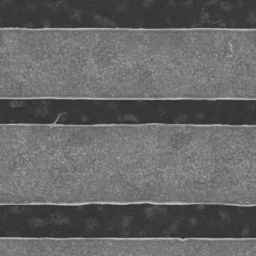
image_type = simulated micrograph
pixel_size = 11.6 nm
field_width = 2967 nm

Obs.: one or a few lines or trenches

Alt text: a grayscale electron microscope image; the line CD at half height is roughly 862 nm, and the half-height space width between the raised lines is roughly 0.351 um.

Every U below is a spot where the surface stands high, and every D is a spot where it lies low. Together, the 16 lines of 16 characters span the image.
DDDDDDDDDDDDDDDD
DDDDDDDDDDDDDDDD
UUUUUUUUUUUUUUUU
UUUUUUUUUUUUUUUU
UUUUUUUUUUUUUUUU
UUUUUUUUUUUUUUUU
DDDDDDDDDDDDDDDD
DDDDDDDDDDDDDDDD
UUUUUUUUUUUUUUUU
UUUUUUUUUUUUUUUU
UUUUUUUUUUUUUUUU
UUUUUUUUUUUUUUUU
UUUUUUUUUUUUUUUU
DDDDDDDDDDDDDDDD
DDDDDDDDDDDDDDDD
UUUUUUUUUUUUUUUU